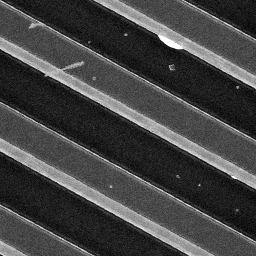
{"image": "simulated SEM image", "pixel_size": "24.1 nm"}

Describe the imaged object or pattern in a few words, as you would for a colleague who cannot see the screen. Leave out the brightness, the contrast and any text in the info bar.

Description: lines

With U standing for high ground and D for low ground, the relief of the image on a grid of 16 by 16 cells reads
UDDDDDDUUUUUDDDD
UUUDDDDDDUUUUUDD
UUUUDDDDDDUUUUUU
DUUUUUDDDDDDUUUU
DDDUUUUUDDDDDDUU
DDDDDUUUUUDDDDDD
DDDDDDUUUUUUDDDD
UUDDDDDDUUUUUUDD
UUUUDDDDDDUUUUUD
UUUUUUDDDDDDUUUU
DDUUUUUUDDDDDDUU
DDDDUUUUUDDDDDDU
DDDDDDUUUUUDDDDD
UDDDDDDUUUUUUDDD
UUUDDDDDDUUUUUUD
UUUUUDDDDDDUUUUU